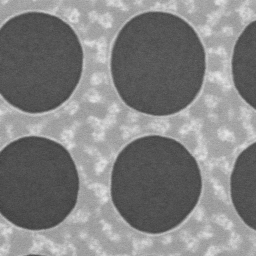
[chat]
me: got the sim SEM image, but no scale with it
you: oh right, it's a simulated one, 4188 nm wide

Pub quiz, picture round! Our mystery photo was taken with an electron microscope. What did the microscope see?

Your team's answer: holes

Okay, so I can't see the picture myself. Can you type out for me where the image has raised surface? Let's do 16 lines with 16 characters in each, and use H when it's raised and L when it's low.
HHHHHHHHHHHHHHHH
LLLLHHHHLLLLHHHH
LLLLLHHLLLLLLHHL
LLLLLHHLLLLLLHLL
LLLLLHHLLLLLLHLL
LLLLLHHLLLLLLHHL
HLLLHHHHLLLLHHHH
HHHHHHHHHHHHHHHH
HHHHHHHHHLHHHHHH
LLLLHHHLLLLLHHHL
LLLLLHHLLLLLHHHL
LLLLLHHLLLLLLHLL
LLLLLHHLLLLLHHLL
LLLLHHHHLLLLHHHL
HHHHHHHHHLHHHHHH
HHHHHHHHHHHHHHHH